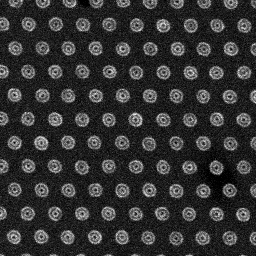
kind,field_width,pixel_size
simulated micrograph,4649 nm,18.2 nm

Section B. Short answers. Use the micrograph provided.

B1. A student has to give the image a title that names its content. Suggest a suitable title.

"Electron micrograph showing a regular array of ring-shaped raised bodies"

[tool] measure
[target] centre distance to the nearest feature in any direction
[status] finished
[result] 0.48 micrometres